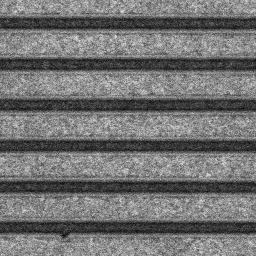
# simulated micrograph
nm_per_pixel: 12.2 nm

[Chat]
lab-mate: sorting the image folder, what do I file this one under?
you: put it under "parallel lines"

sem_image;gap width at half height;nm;175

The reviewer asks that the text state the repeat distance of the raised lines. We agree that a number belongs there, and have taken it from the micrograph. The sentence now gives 497 nm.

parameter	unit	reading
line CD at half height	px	26.7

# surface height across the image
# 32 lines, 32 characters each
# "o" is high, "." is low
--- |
oooooooooooooooooooooooooooooooo
oooooooooooooooooooooooooooooooo
................................
................................
oooooooooooooooooooooooooooooooo
oooooooooooooooooooooooooooooooo
oooooooooooooooooooooooooooooooo
................................
................................
oooooooooooooooooooooooooooooooo
oooooooooooooooooooooooooooooooo
oooooooooooooooooooooooooooooooo
................................
................................
oooooooooooooooooooooooooooooooo
oooooooooooooooooooooooooooooooo
oooooooooooooooooooooooooooooooo
................................
................................
oooooooooooooooooooooooooooooooo
oooooooooooooooooooooooooooooooo
oooooooooooooooooooooooooooooooo
................................
................................
oooooooooooooooooooooooooooooooo
oooooooooooooooooooooooooooooooo
oooooooooooooooooooooooooooooooo
.......................ooooooooo
................................
ooooooo..ooooooooooooooooooooooo
oooooooooooooooooooooooooooooooo
oooooooooooooooooooooooooooooooo